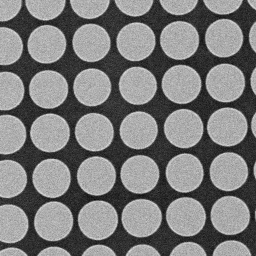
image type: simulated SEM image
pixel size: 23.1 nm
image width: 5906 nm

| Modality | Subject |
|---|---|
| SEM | an array of small figures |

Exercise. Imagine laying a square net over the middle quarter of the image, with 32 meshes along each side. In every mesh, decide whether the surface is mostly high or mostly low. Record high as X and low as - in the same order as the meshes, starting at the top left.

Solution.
----------------------------XXX-
------XXX-------XXXXX-----XXXXXX
----XXXXXX-----XXXXXXX---XXXXXXX
---XXXXXXXX---XXXXXXXXX--XXXXXXX
X--XXXXXXXX---XXXXXXXXX--XXXXXXX
X-XXXXXXXXX---XXXXXXXXX--XXXXXXX
X-XXXXXXXXXX--XXXXXXXXX--XXXXXXX
X--XXXXXXXX---XXXXXXXXX--XXXXXXX
---XXXXXXXX----XXXXXXX----XXXXXX
----XXXXXX------XXXXX-------XXX-
--------------------------------
-----------------------------XX-
------XX---------XXXX------XXXXX
----XXXXXXX----XXXXXXX----XXXXXX
----XXXXXXXX---XXXXXXXX--XXXXXXX
X--XXXXXXXXX--XXXXXXXXX--XXXXXXX
X--XXXXXXXXX--XXXXXXXXX--XXXXXXX
X--XXXXXXXXX--XXXXXXXXX--XXXXXXX
X--XXXXXXXXX--XXXXXXXXX---XXXXXX
X---XXXXXXXX---XXXXXXX-----XXXXX
----XXXXXXX-----XXXXX-------XXXX
------XXX-----------------------
------------------------------X-
-------XXX-------XXXX------XXXXX
-----XXXXXX----XXXXXXXX---XXXXXX
----XXXXXXXX---XXXXXXXX---XXXXXX
X---XXXXXXXXX-XXXXXXXXXX--XXXXXX
X--XXXXXXXXXX-XXXXXXXXXX--XXXXXX
X--XXXXXXXXXX-XXXXXXXXXX--XXXXXX
X---XXXXXXXXX--XXXXXXXX---XXXXXX
X---XXXXXXXX---XXXXXXXX----XXXXX
X----XXXXXX-----XXXXXX------XXXX